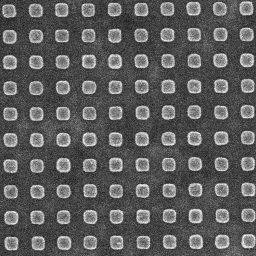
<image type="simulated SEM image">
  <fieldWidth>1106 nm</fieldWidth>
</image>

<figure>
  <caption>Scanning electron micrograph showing a regular array of raised bodies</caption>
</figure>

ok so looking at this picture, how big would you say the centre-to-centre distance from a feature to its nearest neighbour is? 110 nm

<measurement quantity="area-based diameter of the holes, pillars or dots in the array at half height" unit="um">0.0599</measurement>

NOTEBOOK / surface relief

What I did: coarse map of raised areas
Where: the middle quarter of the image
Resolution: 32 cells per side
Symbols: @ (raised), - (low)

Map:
@----@@@---@@@----@@@----@@----@
--------------------------------
--------------------------------
--------------------------------
@----@@-----@@----@@-----@@----@
@----@@@---@@@----@@@----@@@---@
@----@@@---@@@----@@@----@@@---@
--------------------------------
--------------------------------
--------------------------------
--------------------------------
@----@@@---@@@----@@@----@@@---@
@----@@@---@@@----@@@----@@@---@
@----@@@----@@-----@@----@@-----
--------------------------------
--------------------------------
--------------------------------
-----@@-----@@----@@@----@@----@
@----@@@---@@@----@@@----@@@---@
@----@@@---@@@----@@@----@@@---@
--------------------------------
--------------------------------
--------------------------------
--------------------------------
@----@@@----@@----@@@----@@@---@
@----@@@----@@----@@@----@@@---@
@----@@@----@@-----@@----@@-----
--------------------------------
--------------------------------
--------------------------------
@----@@@----@@----@@@----@@@---@
@----@@@----@@@---@@@----@@@---@